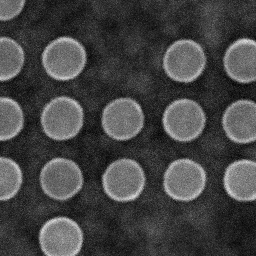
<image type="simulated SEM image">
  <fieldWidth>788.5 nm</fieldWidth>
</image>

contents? a regular array of raised bodies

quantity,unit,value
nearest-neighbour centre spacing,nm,184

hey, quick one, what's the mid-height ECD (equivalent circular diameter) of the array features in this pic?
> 126 nm